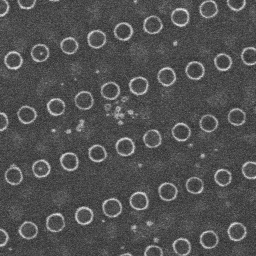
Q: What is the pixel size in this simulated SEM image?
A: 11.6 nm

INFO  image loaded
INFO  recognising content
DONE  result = a regular array of raised bodies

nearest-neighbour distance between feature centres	0.331	micrometres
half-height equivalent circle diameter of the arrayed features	0.199	µm